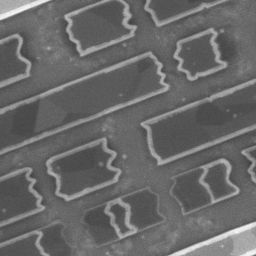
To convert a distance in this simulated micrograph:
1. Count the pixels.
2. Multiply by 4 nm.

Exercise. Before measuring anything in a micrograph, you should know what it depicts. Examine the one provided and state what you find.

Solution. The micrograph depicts one or a few lines or trenches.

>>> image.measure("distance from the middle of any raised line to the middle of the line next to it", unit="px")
63.4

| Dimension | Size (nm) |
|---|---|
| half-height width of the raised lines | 162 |